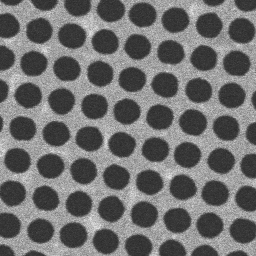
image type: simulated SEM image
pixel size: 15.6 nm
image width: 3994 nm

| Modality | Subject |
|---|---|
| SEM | a regular array of holes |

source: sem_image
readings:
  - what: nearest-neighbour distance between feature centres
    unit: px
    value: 32.6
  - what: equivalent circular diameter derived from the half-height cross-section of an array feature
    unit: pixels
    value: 27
